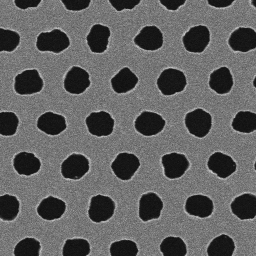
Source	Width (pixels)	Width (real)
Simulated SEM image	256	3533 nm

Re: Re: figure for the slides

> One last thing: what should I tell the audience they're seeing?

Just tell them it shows a regular array of holes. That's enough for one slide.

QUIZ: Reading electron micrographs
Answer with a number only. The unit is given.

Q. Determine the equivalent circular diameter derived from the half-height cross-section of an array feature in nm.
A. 359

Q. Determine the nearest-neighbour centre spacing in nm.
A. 652